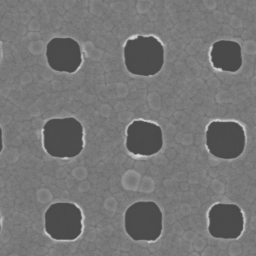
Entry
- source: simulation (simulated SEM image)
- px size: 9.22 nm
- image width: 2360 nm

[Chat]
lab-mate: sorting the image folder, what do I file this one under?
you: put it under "a regular array of holes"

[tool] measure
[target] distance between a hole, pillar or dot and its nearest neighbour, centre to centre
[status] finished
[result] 745 nanometres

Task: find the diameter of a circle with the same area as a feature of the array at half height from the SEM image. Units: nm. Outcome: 358